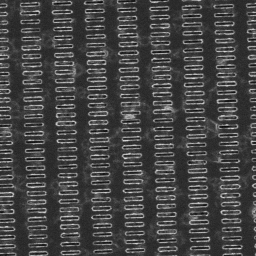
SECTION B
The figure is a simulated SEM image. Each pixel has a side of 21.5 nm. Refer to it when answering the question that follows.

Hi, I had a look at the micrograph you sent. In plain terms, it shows a regular array of holes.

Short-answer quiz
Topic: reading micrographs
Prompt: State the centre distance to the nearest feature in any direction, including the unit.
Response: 184 nanometres